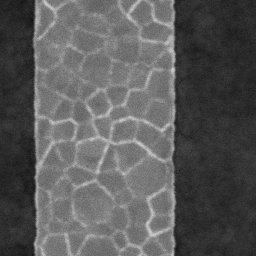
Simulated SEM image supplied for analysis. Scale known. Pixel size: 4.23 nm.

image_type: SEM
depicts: one or a few lines or trenches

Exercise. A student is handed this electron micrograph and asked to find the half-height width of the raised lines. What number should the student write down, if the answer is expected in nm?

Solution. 584